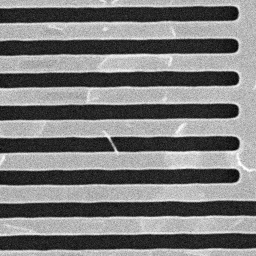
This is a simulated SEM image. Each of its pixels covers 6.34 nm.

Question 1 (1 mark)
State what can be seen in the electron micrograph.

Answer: groups of lines, slits or small figures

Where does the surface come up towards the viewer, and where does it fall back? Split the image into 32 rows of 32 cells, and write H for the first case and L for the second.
HHHHHHHHHHHHHHHHHHHHHHHHHHHHHHHH
LLLLLLLLLLLLLLLLLLLLLLLLLLLLLLHH
LLLLLLLLLLLLLLLLLLLLLLLLLLLLLLHH
HHHHHHHHHHHHHHHHHHHHHHHHHHHHHHHH
HHHHHHHHHHHHHHHHHHHHHHHHHHHHHHHH
LLLLLLLLLLLLLLLLLLLLLLLLLLLLLLHH
LLLLLLLLLLLLLLLLLLLLLLLLLLLLLLHH
HHHHHHHHHHHHHHHHHHHHHHHHHHHHHHHH
HHHHHHHHHHHHHHHHHHHHHHHHHHHHHHHH
LLLLLLLLLLLLLLLLLLLLLLLLLLLLLLHH
LLLLLLLLLLLLLLLLLLLLLLLLLLLLLLHH
HHHHHHHHHHHHHHHHHHHHHHHHHHHHHHHH
HHHHHHHHHHHHHHHHHHHHHHHHHHHHHHHH
LLLLLLLLLLLLLLLLLLLLLLLLLLLLLLHH
LLLLLLLLLLLLLLLLLLLLLLLLLLLLLLHH
HHHHHHHHHHHHHHHHHHHHHHHHHHHHHHHH
HHHHHHHHHHHHHHHHHHHHHHHHHHHHHHHH
LLLLLLLLLLLLLLLLLLLLLLLLLLLLLLHH
LLLLLLLLLLLLLLLLLLLLLLLLLLLLLLHH
HHHHHHHHHHHHHHHHHHHHHHHHHHHHHHHH
HHHHHHHHHHHHHHHHHHHHHHHHHHHHHHHH
LLLLLLLLLLLLLLLLLLLLLLLLLLLLLLHH
LLLLLLLLLLLLLLLLLLLLLLLLLLLLLLHH
HHHHHHHHHHHHHHHHHHHHHHHHHHHHHHHH
HHHHHHHHHHHHHHHHHHHHHHHHHHHHHHHH
LLLLLLLLLLLLLLLLLLLLLLLLLLLLLLLL
LLLLLLLLLLLLLLLLLLLLLLLLLLLLLLLL
HHHHHHHHHHHHHHHHHHHHHHHHHHHHHHHH
HHHHHHHHHHHHHHHHHHHHHHHHHHHHHHHH
LLLLLLLLLLLLLLLLLLLLLLLLLLLLLLLL
LLLLLLLLLLLLLLLLLLLLLLLLLLLLLLLL
HHHHHHHHHHHHHHHHHHHHHHHHHHHHHHHH